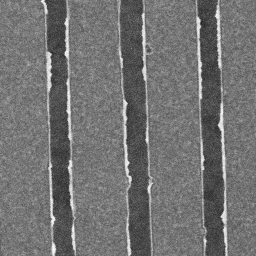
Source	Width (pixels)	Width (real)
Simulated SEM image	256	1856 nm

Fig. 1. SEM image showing one or a few lines or trenches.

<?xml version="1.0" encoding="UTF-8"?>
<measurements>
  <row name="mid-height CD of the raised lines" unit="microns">0.166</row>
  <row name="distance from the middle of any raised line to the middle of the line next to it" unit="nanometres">548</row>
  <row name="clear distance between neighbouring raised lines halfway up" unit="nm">382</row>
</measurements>